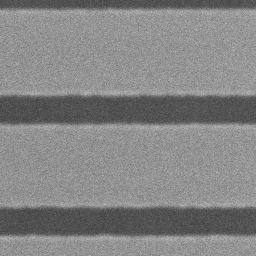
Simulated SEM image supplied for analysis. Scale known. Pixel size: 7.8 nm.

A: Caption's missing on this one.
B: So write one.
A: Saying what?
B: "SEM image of lines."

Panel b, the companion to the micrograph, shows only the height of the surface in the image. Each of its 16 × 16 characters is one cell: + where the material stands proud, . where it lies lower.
................
++++++++++++++++
++++++++++++++++
++++++++++++++++
++++++++++++++++
++++++++++++++++
................
................
++++++++++++++++
++++++++++++++++
++++++++++++++++
++++++++++++++++
++++++++++++++++
................
................
++++++++++++++++